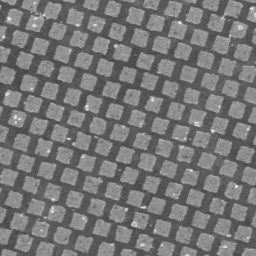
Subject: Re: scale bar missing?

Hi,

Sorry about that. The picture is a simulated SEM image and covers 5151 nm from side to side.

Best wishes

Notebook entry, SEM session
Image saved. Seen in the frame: a regular array of raised bodies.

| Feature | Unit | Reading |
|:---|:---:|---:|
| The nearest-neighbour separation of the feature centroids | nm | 436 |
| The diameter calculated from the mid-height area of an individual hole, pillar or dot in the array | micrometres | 0.337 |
